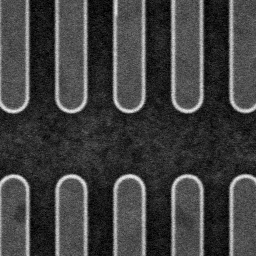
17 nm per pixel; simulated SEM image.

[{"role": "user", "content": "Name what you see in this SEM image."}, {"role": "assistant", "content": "groups of lines, slits or small figures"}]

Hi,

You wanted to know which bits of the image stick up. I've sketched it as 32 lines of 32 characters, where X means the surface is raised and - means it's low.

XXX----XXXX---XXXX----XXX----XXX
XXX----XXXX---XXXX----XXX----XXX
XXX----XXXX---XXXX----XXX----XXX
XXX----XXXX---XXXX----XXX----XXX
XXX----XXXX---XXXX----XXX----XXX
XXX----XXXX---XXXX----XXX----XXX
XXX----XXXX---XXXX----XXX----XXX
XXX----XXXX---XXXX----XXX----XXX
XXX----XXXX---XXXX----XXX----XXX
XXX----XXXX---XXXX----XXX----XXX
XXX----XXXX---XXXX----XXX----XXX
XXX----XXXX---XXXX----XXX----XXX
XXX----XXXX---XXXX----XXX----XXX
XXX-----XX-----XX-----XX------XX
--------------------------------
--------------------------------
--------------------------------
--------------------------------
--------------------------------
--------------------------------
--------------------------------
--------------------------------
XXX-----XX-----XX-----XXX----XXX
XXX----XXXX---XXXX----XXX----XXX
XXX----XXXX---XXXX----XXX----XXX
XXX----XXXX---XXXX----XXX----XXX
XXX----XXXX---XXXX----XXX----XXX
XXX----XXXX---XXXX----XXX----XXX
XXX----XXXX---XXXX----XXX----XXX
XXX----XXXX---XXXX----XXX----XXX
XXX----XXXX---XXXX----XXX----XXX
XXX----XXXX---XXXX----XXX----XXX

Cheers